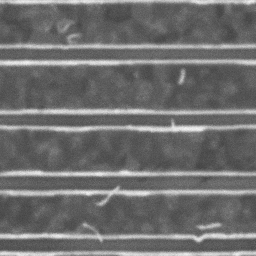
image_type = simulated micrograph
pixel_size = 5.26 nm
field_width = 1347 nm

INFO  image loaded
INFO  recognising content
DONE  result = one or a few lines or trenches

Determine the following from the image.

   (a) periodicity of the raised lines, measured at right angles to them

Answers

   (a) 336 nanometres